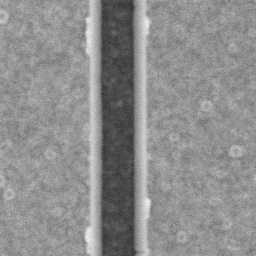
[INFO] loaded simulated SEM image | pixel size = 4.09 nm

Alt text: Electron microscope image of one or a few lines or trenches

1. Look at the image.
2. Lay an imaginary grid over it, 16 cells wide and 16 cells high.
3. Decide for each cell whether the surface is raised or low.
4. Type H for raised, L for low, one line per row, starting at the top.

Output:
HHHHHHLLLHHHHHHH
HHHHHHLLLHHHHHHH
HHHHHHLLLHHHHHHH
HHHHHHLLLHHHHHHH
HHHHHHLLLHHHHHHH
HHHHHHLLLHHHHHHH
HHHHHHLLLHHHHHHH
HHHHHHLLLHHHHHHH
HHHHHHLLLHHHHHHH
HHHHHHLLLHHHHHHH
HHHHHHLLLHHHHHHH
HHHHHHLLLHHHHHHH
HHHHHHLLLHHHHHHH
HHHHHHLLLHHHHHHH
HHHHHHLLLHHHHHHH
HHHHHHLLLHHHHHHH